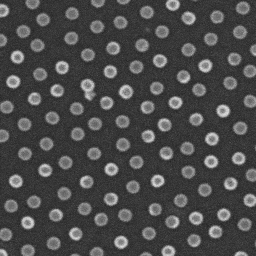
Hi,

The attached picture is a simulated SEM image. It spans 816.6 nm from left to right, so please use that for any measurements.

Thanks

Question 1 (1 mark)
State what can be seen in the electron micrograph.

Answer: a regular array of raised bodies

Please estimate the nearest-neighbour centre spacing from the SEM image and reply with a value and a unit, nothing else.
73.9 nm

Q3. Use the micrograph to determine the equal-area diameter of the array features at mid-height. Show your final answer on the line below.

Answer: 0.0397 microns